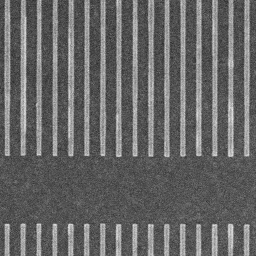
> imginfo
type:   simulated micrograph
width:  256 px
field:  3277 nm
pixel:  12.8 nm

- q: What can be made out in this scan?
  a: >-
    parallel lines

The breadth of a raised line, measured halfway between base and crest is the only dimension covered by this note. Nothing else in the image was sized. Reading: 54.4 nanometers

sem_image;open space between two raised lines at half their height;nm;150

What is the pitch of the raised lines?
16 px